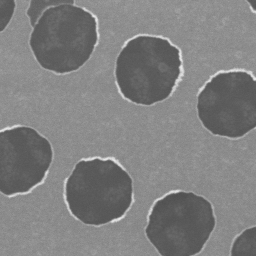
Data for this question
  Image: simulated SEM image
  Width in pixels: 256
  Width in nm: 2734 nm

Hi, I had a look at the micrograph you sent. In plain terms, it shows holes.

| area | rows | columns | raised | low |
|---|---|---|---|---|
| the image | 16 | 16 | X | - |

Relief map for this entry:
-X---XXXXXXXXXXX
XX----XXXXXXXXXX
XX----XX--XXXXXX
XX----X----XXXXX
XXX-XXX----XXXXX
XXXXXXX----XX---
XXXXXXXXXXXX----
XXXXXXXXXXXXX---
---XXXXXXXXXXX-X
---XXXXXXXXXXXXX
---XX---XXXXXXXX
--XX----XXXXXXXX
XXXX----XX---XXX
XXXXX--XX----XXX
XXXXXXXXX----XX-
XXXXXXXXXX---XX-